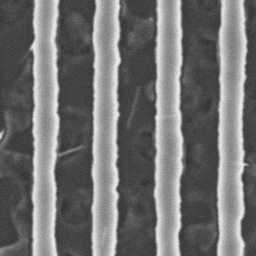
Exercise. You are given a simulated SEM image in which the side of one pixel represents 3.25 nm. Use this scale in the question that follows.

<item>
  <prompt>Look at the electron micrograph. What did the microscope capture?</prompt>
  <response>lines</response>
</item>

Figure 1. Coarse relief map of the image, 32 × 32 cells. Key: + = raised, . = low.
....+++.....+++.....+++.....++..
....+++.....+++.....+++.....++..
....+++.....+++.....+++.....+++.
....+++.....+++.....+++.....+++.
....+++.....+++.....+++....++++.
....+++.....+++.....+++....++++.
....+++.....+++.....+++.....+++.
....+++.....+++.....+++.....+++.
....+++.....+++.....+++.....+++.
....+++.....+++.....++.....++++.
....+++.....+++.....++.....+++..
....+++.....+++.....++......++..
....+++.....+++.....++......++..
....+++.....+++.....++.....+++..
....+++.....+++.....+++....+++..
....+++.....+++.....+++....+++..
....+++.....+++.....+++....+++..
....+++.....+++.....+++....+++..
....+++.....+++.....+++....+++..
....+++.....+++.....+++....+++..
....+++.....++.....++++....++++.
....+++.....+++....++++....+++..
....+++.....+++....+++.....+++..
....+++.....+++....+++.....+++..
....+++.....+++....+++.....+++..
....+++.....+++.....+++....+++..
....+++.....+++.....++.....+++..
....+++.....+++.....+++....+++..
....+++.....+++.....+++....+++..
....+++.....+++.....++.....+++..
....+++.....++......++.....+++..
....+++.....++......++.....+++..